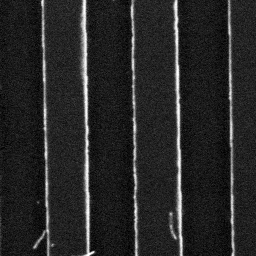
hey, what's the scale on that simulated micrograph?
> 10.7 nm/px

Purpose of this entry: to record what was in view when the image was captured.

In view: lines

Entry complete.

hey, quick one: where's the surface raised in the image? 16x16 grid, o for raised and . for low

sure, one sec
...oo...ooo...oo
...oo...ooo...oo
...oo...ooo...oo
...oo...ooo...oo
...oo...ooo...oo
...oo...ooo...oo
...oo...ooo...oo
...oo...ooo...oo
...oo...ooo...oo
...oo...ooo...oo
...oo...ooo...oo
...oo...ooo...oo
...ooo..ooo...oo
...oo...ooo...oo
...ooo..ooo....o
...ooo...oo....o